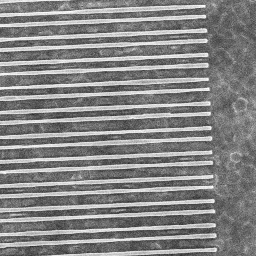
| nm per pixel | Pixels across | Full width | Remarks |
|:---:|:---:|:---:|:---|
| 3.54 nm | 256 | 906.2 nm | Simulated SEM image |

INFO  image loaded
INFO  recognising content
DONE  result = parallel lines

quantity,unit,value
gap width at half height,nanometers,33.6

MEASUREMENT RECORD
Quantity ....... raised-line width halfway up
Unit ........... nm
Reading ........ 12.4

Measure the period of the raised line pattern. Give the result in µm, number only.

0.0429